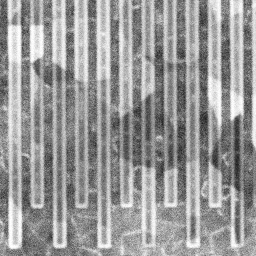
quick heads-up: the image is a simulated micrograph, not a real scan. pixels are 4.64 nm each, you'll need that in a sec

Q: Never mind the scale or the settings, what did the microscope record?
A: parallel lines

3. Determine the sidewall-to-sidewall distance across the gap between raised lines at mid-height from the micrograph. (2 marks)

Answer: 56.9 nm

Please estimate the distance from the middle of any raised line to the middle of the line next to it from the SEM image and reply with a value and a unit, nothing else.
103 nm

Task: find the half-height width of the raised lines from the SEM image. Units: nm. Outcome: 48.2